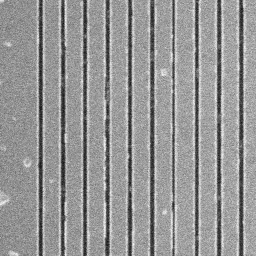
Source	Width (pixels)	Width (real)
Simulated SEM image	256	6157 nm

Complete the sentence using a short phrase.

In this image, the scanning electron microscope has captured parallel lines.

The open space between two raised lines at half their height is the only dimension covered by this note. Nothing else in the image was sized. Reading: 132 nanometers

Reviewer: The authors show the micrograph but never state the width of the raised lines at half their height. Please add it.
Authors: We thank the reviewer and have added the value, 397 nm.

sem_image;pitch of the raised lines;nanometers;536